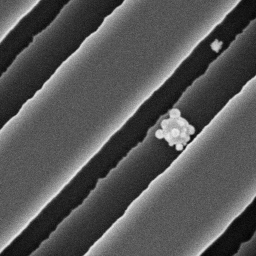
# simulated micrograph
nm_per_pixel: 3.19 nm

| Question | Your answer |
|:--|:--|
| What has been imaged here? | lines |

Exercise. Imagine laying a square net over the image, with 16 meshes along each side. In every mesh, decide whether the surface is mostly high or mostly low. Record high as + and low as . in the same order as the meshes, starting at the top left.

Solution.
++.....++++++++.
+.....++++++++..
.....++++++++...
....++++++++....
...++++++++.....
...+++++++.....+
..+++++++.....++
.+++++++.....+++
+++++++.....++++
++++++.....+++++
+++++.....++++++
++++.....+++++++
+++.....++++++++
++......+++++++.
+......+++++++..
......+++++++...